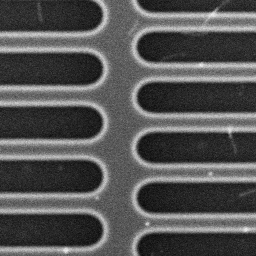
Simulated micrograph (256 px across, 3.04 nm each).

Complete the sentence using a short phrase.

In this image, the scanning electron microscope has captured groups of lines, slits or small figures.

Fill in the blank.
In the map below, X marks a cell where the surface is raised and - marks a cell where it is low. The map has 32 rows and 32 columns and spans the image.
------------XXXXX---------------
-------------XXXXX--------------
-------------XXXXXXXXXXXXXXXXXXX
------------XXXXXXXXXXXXXXXXXXXX
XXXXXXXXXXXXXXXXXX--------------
XXXXXXXXXXXXXXXXX---------------
-----------XXXXXX---------------
-------------XXXXX--------------
-------------XXXXXXXXXXXXXXXXXXX
-------------XXXXXXXXXXXXXXXXXXX
------------XXXXXX--------------
XXXXXXXXXXXXXXXXX---------------
XXXXXXXXXXXXXXXXX---------------
------------XXXXXX--------------
-------------XXXXXXXXXXXXXXXXXXX
-------------XXXXXXXXXXXXXXXXXXX
-------------XXXXXX-------------
-----------XXXXXX---------------
XXXXXXXXXXXXXXXXX---------------
XXXXXXXXXXXXXXXXX---------------
------------XXXXXXX-------------
-------------XXXXXXXXXXXXXXXXXXX
-------------XXXXXXXXXXXXXXXXXXX
------------XXXXX---------------
XXXXXXXXXXXXXXXXX---------------
XXXXXXXXXXXXXXXXX---------------
XXXX-XXXXXXXXXXXXX--------------
-------------XXXXXXXXXXXXXXXXXXX
-------------XXXXXXXXXXXXXXXXXXX
-------------XXXXX--------------
------------XXXXX---------------
XXXXXXXXXXXXXXXXX---------------